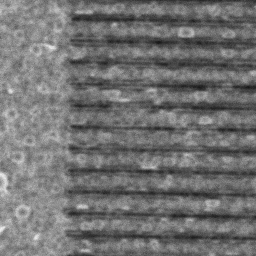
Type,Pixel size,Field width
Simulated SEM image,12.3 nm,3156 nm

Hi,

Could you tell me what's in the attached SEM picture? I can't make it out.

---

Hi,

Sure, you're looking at parallel lines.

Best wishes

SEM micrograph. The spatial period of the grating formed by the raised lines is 267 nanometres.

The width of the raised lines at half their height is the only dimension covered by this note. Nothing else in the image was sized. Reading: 0.0663 micrometres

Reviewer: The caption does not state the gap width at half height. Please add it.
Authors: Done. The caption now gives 200 nm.